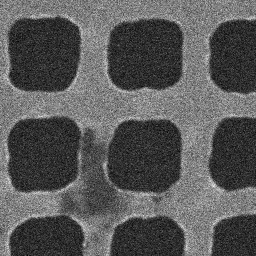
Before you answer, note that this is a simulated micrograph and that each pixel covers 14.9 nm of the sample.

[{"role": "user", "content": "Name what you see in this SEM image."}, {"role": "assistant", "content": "holes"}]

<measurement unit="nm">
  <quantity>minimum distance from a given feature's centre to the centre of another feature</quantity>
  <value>1500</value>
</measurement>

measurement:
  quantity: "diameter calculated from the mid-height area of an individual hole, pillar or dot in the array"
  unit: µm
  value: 1.19